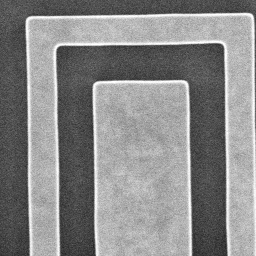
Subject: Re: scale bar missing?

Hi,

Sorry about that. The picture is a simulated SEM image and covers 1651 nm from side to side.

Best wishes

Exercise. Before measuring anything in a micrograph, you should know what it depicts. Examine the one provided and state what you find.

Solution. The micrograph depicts groups of lines, slits or small figures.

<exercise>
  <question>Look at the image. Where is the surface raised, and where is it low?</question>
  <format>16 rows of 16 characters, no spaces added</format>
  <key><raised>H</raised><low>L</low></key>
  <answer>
LLLLLLLLLLLLLLLL
LLHHHHHHHHHHHHHH
LLHHHHHHHHHHHHHH
LLHLLLLLLLLLLLHH
LLHHLLLLLLLLLLHH
LLHHLLHHHHHHLLHH
LLHHLLHHHHHHLLHH
LLHHLLHHHHHHLLHH
LLHHLLHHHHHHLLHH
LLHHLLHHHHHHLLHH
LLHHLLHHHHHHLLHH
LLHHLLHHHHHHLLHH
LLHHLLHHHHHHLLHH
LLHHLLHHHHHHLLHH
LLHHLLHHHHHHLLHH
LLHHLLHHHHHHLLHH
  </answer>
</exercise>